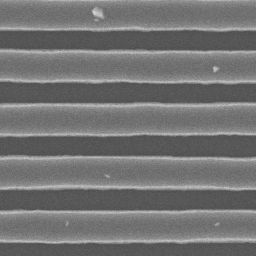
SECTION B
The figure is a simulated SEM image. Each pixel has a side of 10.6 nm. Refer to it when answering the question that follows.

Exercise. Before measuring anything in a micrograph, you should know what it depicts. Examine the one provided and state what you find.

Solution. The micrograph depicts lines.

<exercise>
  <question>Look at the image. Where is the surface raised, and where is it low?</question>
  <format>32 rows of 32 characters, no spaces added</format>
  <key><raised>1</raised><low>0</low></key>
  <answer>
11111111111111111111111111111111
11111111111111111111111111111111
11111111111111111111111111111111
11111111111111111111111111111111
00000000000000000000000000000000
00000000000000000000000000000000
11111111111111111111111111111111
11111111111111111111111111111111
11111111111111111111111111111111
11111111111111111111111111111111
00000000000000000000000000000000
00000000000000000000000000000000
00000000000000000000000000000000
11111111111111111111111111111111
11111111111111111111111111111111
11111111111111111111111111111111
11111111111111111111111111111111
00000000000000000000000000000000
00000000000000000000000000000000
00000000000000000000000000000000
11111111111111111111111111111111
11111111111111111111111111111111
11111111111111111111111111111111
11111110000011110111111111111111
00000000000000000000000000000000
00000000000000000000000000000000
11111111111111111111111111111111
11111111111111111111111111111111
11111111111111111111111111111111
11111111111111111111111111111111
00000000000000000000000000000000
00000000000000000000000000000000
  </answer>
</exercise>